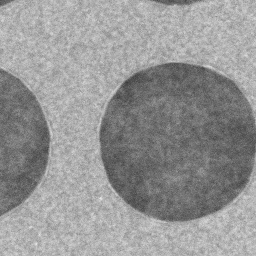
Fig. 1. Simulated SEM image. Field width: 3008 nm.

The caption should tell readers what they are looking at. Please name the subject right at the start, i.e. holes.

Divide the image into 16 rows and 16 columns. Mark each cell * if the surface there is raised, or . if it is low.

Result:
****************
****************
****************
****************
.********.....**
..*****........*
...****.........
...***..........
...***..........
...***..........
...****.........
..*****........*
..******.......*
*********....***
****************
****************